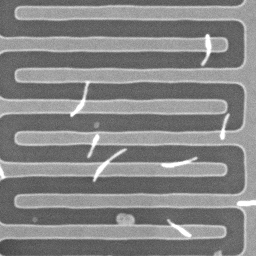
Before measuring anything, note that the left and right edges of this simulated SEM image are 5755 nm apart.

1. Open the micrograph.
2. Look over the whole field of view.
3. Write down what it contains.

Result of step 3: groups of lines, slits or small figures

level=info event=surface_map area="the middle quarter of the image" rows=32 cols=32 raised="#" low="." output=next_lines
................................
################################
################################
################################
##..##############.......####...
................................
................................
................................
................................
################################
################################
################################
..#.............................
................................
................................
................................
................................
################################
################################
################################
................................
................................
................................
................................
..........#...................##
################################
################################
################################
................................
................................
................................
................................